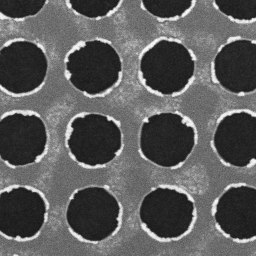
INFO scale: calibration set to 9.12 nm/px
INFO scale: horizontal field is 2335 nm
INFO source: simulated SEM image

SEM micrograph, holes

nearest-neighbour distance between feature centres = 72.4 pixels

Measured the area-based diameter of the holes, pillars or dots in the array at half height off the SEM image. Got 482 nanometers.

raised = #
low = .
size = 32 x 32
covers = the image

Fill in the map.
......###......###......###.....
.....#####....#####....#####....
################################
################################
################################
#...#######...######...#####....
.....####......###......###.....
......###......###......###.....
......##.......###......###.....
......###......###......###.....
.....####.....####.....#####....
#..########..#######..#######.##
################################
################################
#....######..######...#######...
.....####.....####.....####.....
......###......###......###.....
......###......###......###.....
......###......###......###.....
.....####.....####.....#####....
#..########..#######..#######..#
################################
################################
##.########..################..#
.....####.....####.....#####....
......###......###......###.....
......##.......##.......###.....
.....###.......###......###.....
.....####......####.....####....
#...######....######..#######...
################################
################################